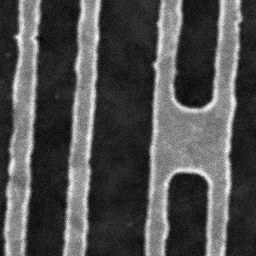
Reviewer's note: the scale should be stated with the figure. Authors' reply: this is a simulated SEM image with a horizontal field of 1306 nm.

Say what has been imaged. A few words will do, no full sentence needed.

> one or a few lines or trenches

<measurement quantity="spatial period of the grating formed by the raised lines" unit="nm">341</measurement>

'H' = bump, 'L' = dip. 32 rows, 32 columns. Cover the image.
LLLHHLLLLLHHLLLLLLLLHHHLLLLLHHLL
LLLHHLLLLLHHLLLLLLLLHHLLLLLLHHLL
LLLHHLLLLLHHLLLLLLLLHHLLLLLLHHLL
LLLHLLLLLLHHLLLLLLLLHHLLLLLLHHLL
LLHHLLLLLLHHLLLLLLLLHHLLLLLLHHLL
LLLHHLLLLLHHLLLLLLLLHHLLLLLHHHLL
LLLHLLLLLLHHLLLLLLLLHHLLLLLHHHLL
LLHHLLLLLLHHLLLLLLLLHHLLLLLHHHLL
LLHHLLLLLLHHLLLLLLLLHHLLLLLHHHLL
LLHHLLLLLLHHLLLLLLLLHHLLLLLHHLLL
LLHHLLLLLLHHLLLLLLLLHHLLLLLHHLLL
LLHHLLLLLLHHLLLLLLLLHHLLLLLHHLLL
LLHHLLLLLHHHLLLLLLLHHHLLLLLHHLLL
LLHHLLLLLHHHLLLLLLLHHHHLLLHHHLLL
LLHHLLLLLHHLLLLLLLLHHHHHHHHHHLLL
LLHHLLLLLHHLLLLLLLLHHHHHHHHHHLLL
LLHHLLLLLHHLLLLLLLLHHHHHHHHHHLLL
LLHHLLLLLHHLLLLLLLLHHHHHHHHHHLLL
LLHHLLLLLHHLLLLLLLLHHHHHHHHHHLLL
LLHHLLLLLHHLLLLLLLLHHHHHHHHHLLLL
LHHHLLLLLHHLLLLLLLLHHHHHHHHHLLLL
LHHHLLLLLHHLLLLLLLLHHHLLLHHHHLLL
LHHHLLLLLHHLLLLLLLLHHLLLLLHHHLLL
LHHHLLLLLHHLLLLLLLLHHLLLLLHHHLLL
LHHLLLLLLHHLLLLLLLLHHLLLLLHHLLLL
LHHLLLLLLHHLLLLLLLLHHLLLLLHHLLLL
LHHLLLLLLHHLLLLLLLLHHLLLLLHHLLLL
LHHLLLLLHHHLLLLLLLLHHLLLLLHHLLLL
LHHLLLLLHHHLLLLLLLHHHLLLLLHHLLLL
LHHLLLLLHHHLLLLLLLHHHLLLLLHHLLLL
LHHLLLLLHHHLLLLLLLHHLLLLLLHHLLLL
LHHLLLLLHHLLLLLLLLHHLLLLLLHHLLLL